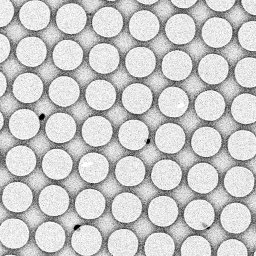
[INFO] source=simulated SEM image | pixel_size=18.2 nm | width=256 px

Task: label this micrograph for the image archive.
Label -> an array of small figures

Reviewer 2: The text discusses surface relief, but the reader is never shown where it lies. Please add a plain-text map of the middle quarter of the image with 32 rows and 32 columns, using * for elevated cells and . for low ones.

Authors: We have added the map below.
****...******...*******..*******
........****....******...*******
.................****....******.
*.........................****..
***....****.....................
****..******....****............
****..*******..******....****...
****..*******..*******..******..
***...*******..*******..*******.
***...*******..*******..*******.
.......*****...*******..*******.
................*****...******..
.........................*****..
**.....***......................
***..******.....***.............
***..*******..******.....****...
***..*******..*******...******..
***..*******..*******..*******..
**...*******..*******..*******..
......*****...*******..*******..
...............*****...*******..
........................*****...
*.....***.......................
**...*****.....***..............
**..*******...*****.....****....
**..*******..*******...******...
**..*******..*******..*******...
*...*******..*******..*******..*
.....*****...*******..*******..*
......***.....*****...*******..*
.......................*****...*
.....***........................